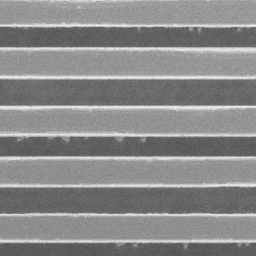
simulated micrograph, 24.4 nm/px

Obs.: lines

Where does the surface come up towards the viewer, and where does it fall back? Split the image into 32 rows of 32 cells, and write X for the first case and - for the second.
XXXXXXXXXXXXXXXXXXXXXXXXXXXXXXXX
XXXXXXXXXXXXXXXXXXXXXXXXXXXXXXXX
XXXXXXXXXXXXXXXXXXXXXXXXXXXXXXXX
--------------------------------
--------------------------------
--------------------------------
XXXXXXXXXXXXXXXXXXXXXXXXXXXXXXXX
XXXXXXXXXXXXXXXXXXXXXXXXXXXXXXXX
XXXXXXXXXXXXXXXXXXXXXXXXXXXXXXXX
XXXXXXXXXXXXXXXXXXXXXXXXXXXXXXXX
--------------------------------
--------------------------------
--------------------------------
XXXXXXXXXXXXXXXXXXXXXXXXXXXXXXXX
XXXXXXXXXXXXXXXXXXXXXXXXXXXXXXXX
XXXXXXXXXXXXXXXXXXXXXXXXXXXXXXXX
XXXXXXXXXXXXXXXXXXXXXXXXXXXXXXXX
--------------------------------
--------------------------------
--------------------------------
XXXXXXXXXXXXXXXXXXXXXXXXXXXXXXXX
XXXXXXXXXXXXXXXXXXXXXXXXXXXXXXXX
XXXXXXXXXXXXXXXXXXXXXXXXXXXXXXXX
--------------------------------
--------------------------------
--------------------------------
--------------------------------
XXXXXXXXXXXXXXXXXXXXXXXXXXXXXXXX
XXXXXXXXXXXXXXXXXXXXXXXXXXXXXXXX
XXXXXXXXXXXXXXXXXXXXXXXXXXXXXXXX
--------------------------------
--------------------------------